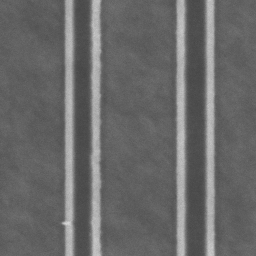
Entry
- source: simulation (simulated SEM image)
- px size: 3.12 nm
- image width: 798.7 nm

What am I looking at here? one or a few lines or trenches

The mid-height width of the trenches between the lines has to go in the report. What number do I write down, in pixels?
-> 84.5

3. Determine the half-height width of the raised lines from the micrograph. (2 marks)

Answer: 91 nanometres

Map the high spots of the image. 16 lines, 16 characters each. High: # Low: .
....##.....##...
....##.....##...
....##.....##...
....##.....##...
....##.....##...
....##.....##...
....##.....##...
....##.....##...
....##.....##...
....##.....##...
....##.....##...
....##.....##...
....##.....##...
....##.....##...
....##.....##...
....##.....##...